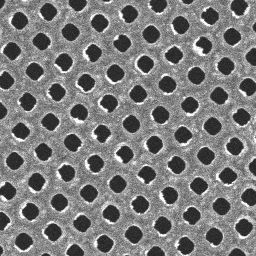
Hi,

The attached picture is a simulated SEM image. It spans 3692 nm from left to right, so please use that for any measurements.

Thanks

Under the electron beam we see a regular array of holes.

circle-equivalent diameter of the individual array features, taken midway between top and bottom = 245 nm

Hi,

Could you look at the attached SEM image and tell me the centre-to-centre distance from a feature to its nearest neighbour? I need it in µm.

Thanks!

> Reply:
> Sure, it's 0.435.